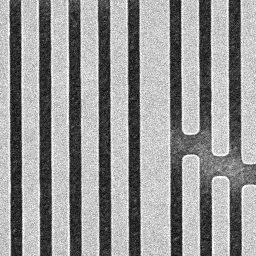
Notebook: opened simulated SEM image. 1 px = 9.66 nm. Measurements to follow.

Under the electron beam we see groups of lines, slits or small figures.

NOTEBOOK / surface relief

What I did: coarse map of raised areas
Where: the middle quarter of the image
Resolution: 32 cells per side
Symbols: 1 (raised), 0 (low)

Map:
10001111000011110001111111000111
10001111000011110001111111000111
10001111000011110001111111000111
10001111000011110001111111000111
10001111000011110001111111000011
10001111100011110001111111000011
10001111100011110001111111000011
10001111100011110001111111000011
10001111100011110001111111000011
10001111100011110001111111000011
10001111100011110001111111000011
10001111100011110001111111000011
10001111100011110001111111000011
10001111100011110001111111000011
10001111100011110001111111000011
10001111100011110001111111000011
10001111100011110001111111000011
10001111100011110001111111000000
10001111100011110001111111000000
10001111100011110001111111000000
10001111100011110001111111000000
10001111100011110001111111000000
10001111100011110001111111000000
10001111100011110001111111000011
10001111100011110001111111000011
10001111100011110001111111000011
10001111100011110001111111000011
10001111100011110001111111000011
10001111100011110001111111000011
10001111100011110001111111000011
10001111100011110001111111000011
10001111100011110001111111000011